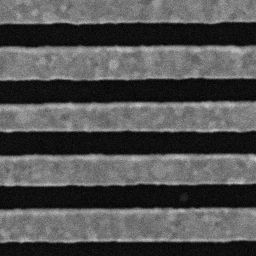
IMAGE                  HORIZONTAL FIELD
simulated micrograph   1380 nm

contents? lines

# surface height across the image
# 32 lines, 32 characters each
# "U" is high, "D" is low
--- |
UUUUUUUUUUUUUUUUUUUUUUUUUUUUUUUU
UUUUUUUUUUUUUUUUUUUUUUUUUUUUUUUU
UUUUUUUUUUUUUUUUUUUUUUUUUUUUUUUU
DDDDDDDDDDDDDDDDDDDDDDDDDDDDDDDD
DDDDDDDDDDDDDDDDDDDDDDDDDDDDDDDD
DDDDDDDDDDDDDDDDDDDDDDDDDDDDDDDD
UUUUUUUUUUUUUUUUUUUUUUUUUUUUUUUU
UUUUUUUUUUUUUUUUUUUUUUUUUUUUUUUU
UUUUUUUUUUUUUUUUUUUUUUUUUUUUUUUU
UUUUUUUUUUUUUUUUUUUUUUUUUUUUUUUU
DDDDDDDDDDDDDDDDDDDDDDDDDDDDDDDD
DDDDDDDDDDDDDDDDDDDDDDDDDDDDDDDD
DDDDDDDDDDDDDDDDDDDDDDDDDDDDDDDD
UUUUUUUUUUUUUUUUUUUUUUUUUUUUUUUU
UUUUUUUUUUUUUUUUUUUUUUUUUUUUUUUU
UUUUUUUUUUUUUUUUUUUUUUUUUUUUUUUU
DDDDDDDDDDDDDDDDDDDDDDDDDDDDDDDD
DDDDDDDDDDDDDDDDDDDDDDDDDDDDDDDD
DDDDDDDDDDDDDDDDDDDDDDDDDDDDDDDD
DDDUUUDDDDUUUUUUUDUUUUUUUUUUUUUU
UUUUUUUUUUUUUUUUUUUUUUUUUUUUUUUU
UUUUUUUUUUUUUUUUUUUUUUUUUUUUUUUU
UUUUUUUUUUUUUUUUUUUUUUUUUUUUUUUU
DDDDDDDDDDDDDDDDDDDDDDDDDDDDDDDD
DDDDDDDDDDDDDDDDDDDDDDDDDDDDDDDD
DDDDDDDDDDDDDDDDDDDDDDDDDDDDDDDD
UUUUUUUUUUUUUUUUUUUUUUUUUUUUUUUU
UUUUUUUUUUUUUUUUUUUUUUUUUUUUUUUU
UUUUUUUUUUUUUUUUUUUUUUUUUUUUUUUU
UUUUUUUUUUUUUUUUUUUUUUUUUUUUUUUU
DDDDDDDDDDDDDDDDDDDDDDDDDDDDDDDD
DDDDDDDDDDDDDDDDDDDDDDDDDDDDDDDD